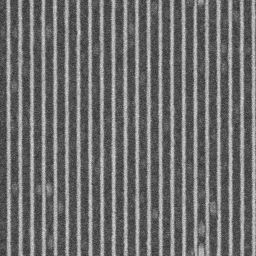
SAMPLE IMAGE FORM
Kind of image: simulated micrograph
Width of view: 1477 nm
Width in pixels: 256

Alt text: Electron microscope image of parallel lines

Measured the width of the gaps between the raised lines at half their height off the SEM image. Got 52.7 nanometers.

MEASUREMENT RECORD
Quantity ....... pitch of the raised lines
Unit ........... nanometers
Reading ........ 67.3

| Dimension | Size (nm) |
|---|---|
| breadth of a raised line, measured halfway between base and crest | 13.7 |